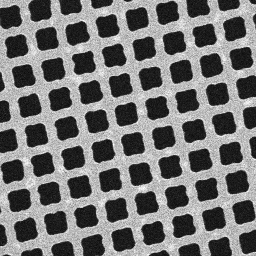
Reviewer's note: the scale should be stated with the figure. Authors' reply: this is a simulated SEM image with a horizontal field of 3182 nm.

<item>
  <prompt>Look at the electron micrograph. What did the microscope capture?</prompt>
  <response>a regular array of holes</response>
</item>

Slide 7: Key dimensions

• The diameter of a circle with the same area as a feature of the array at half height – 0.292 µm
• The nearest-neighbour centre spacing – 0.374 microns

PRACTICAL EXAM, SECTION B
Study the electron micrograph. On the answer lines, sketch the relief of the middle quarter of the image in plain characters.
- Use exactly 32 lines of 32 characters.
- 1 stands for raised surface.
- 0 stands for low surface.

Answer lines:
11100000110000111111111111100000
11000000111111111110000011000000
11100111111111001110000011100000
11111111111000000110000011100000
11111100011000000110000001100111
11110000011000000110000011111111
01110000011100000111011111111110
00110000001100001111111111110000
00110000001111111111111001110000
00110000111111111111000000110000
00111111111110000011000000110000
11111111101110000011100000110000
11111000000110000011100000111111
00011000000110000011100001111111
00011000000110000011111111111100
00011100000111001111111111011100
00011100000111111111110000011100
00001111111111111001110000011100
00111111111111000000110000001100
11111111000011000000111000001110
11101110000011100000111000011111
00000110000011100000111111111111
00000110000001100001111111111110
00000110000011111111111100000110
00000111001111111111111100000110
00000111111111111000011100000111
10111111110000110000001100000111
11111111100000110000001100000111
11000011100000111000001110011111
10000011100000111000001111111111
10000001100000111111111111111011
10000001100000111111111110000001